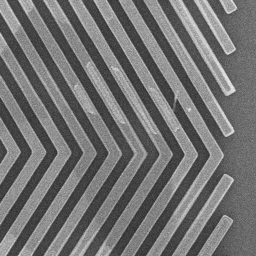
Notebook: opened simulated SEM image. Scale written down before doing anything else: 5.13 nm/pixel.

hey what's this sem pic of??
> groups of lines, slits or small figures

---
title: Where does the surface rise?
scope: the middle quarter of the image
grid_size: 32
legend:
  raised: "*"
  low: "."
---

**...***...***...***...****...**
**...***...****...***...***...**
***...***...***...****...***...*
***...****...***...***...***...*
.***...***...***...****...***...
.****..****...***...***....***..
..***...***...****...***...***..
...***...***...***...****...***.
...***...***....***...***...***.
....***...***...***....***...***
*...***...****...***...***...***
**...***...***....***...***...**
**....***...***...***....***...*
***...***...***....***...***...*
.***...***...***....**....***...
.***...***....***...***...***...
..***...***...***....***...***..
..***...****...***...***....**..
...***...***....**....***...***.
....***...***...***....**...****
*...***...***....**....***...***
**...***...***...***....***...**
**...***...***....**....***...**
*...***....***...***....***...**
....***...***....**....***...***
...***...****...***...****...***
..****...***...***....***...***.
..***...***...****...***....**..
.***...****...***...****...***..
.***...***...****...***...***...
***...***....***...***....**....
**....***...***...****...***...*